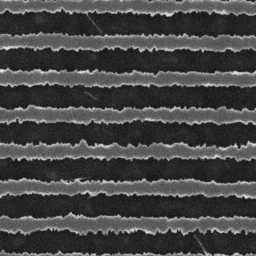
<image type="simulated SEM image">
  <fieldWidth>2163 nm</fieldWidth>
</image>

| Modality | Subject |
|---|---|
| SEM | parallel lines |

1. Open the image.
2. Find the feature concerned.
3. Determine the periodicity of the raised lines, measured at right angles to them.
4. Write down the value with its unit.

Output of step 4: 307 nm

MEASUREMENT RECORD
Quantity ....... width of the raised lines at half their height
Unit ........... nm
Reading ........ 120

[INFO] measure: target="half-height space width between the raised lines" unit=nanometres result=187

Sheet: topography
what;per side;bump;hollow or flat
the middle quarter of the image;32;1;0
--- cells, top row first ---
00000000000000000000000000000000
00000000000000000000000000000000
11111111111111111111110111111111
11111111111111111111111111111111
11111111111111111111111111111111
01000110111101000000000110000001
00000000000000000000000000000000
00000000000000000000000000000000
00000000000000000000000000000000
00000000000000000000000000000000
00000000000000000000000000000000
11111111111110011111111111111111
11111111111111111111111111111111
11111111111111111111111111111111
01111100101111100000000001101111
00000000000000000000000000000000
00000000000000000000000000000000
00000000000000000010000000000000
00000000000000000000000000000001
00001000000000000000000000000000
11011100111111001011111111111110
11111111111111111111111111111111
11111111111111111111111111111111
00110100111100011011100111100111
00000000000000000000000000000000
00000000000000000000000000000000
00000000000000000000000000000000
00000000000000010000000000000000
00000000000000000000000000000000
10110111101100110111101111111111
11111111111111111111111111111111
11111111111111111111111111111111